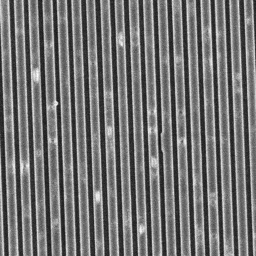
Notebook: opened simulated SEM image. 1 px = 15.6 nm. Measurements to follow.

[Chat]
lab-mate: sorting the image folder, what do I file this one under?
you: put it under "parallel lines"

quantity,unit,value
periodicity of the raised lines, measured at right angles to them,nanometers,224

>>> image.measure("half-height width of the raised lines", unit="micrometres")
0.133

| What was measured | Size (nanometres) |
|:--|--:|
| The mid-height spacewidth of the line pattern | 91.7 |